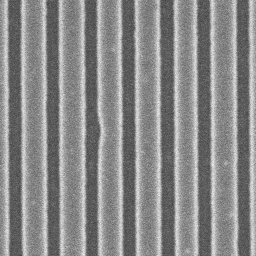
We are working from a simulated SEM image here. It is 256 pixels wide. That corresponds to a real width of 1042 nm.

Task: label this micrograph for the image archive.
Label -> parallel lines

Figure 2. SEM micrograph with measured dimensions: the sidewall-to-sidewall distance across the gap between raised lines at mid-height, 0.059 microns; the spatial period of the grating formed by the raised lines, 154 nanometers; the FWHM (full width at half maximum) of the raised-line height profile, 95.6 nm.